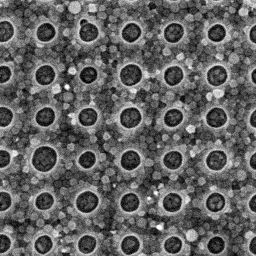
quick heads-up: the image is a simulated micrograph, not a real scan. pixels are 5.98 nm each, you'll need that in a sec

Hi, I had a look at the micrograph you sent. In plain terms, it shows a regular array of holes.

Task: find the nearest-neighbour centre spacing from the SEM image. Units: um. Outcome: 0.253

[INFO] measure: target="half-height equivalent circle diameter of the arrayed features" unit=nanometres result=116